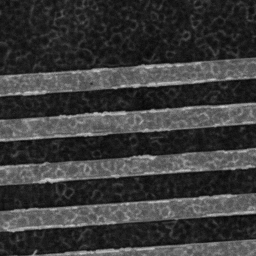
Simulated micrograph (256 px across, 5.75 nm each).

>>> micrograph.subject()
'parallel lines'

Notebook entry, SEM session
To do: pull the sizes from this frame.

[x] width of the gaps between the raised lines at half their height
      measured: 0.144 µm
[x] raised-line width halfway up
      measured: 116 nanometers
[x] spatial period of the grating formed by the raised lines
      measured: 259 nm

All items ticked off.